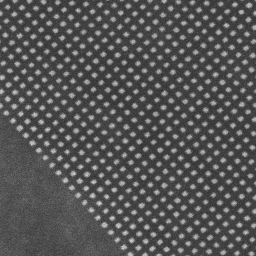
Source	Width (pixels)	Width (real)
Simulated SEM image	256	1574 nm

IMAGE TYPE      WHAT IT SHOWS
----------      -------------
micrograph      a regular array of raised bodies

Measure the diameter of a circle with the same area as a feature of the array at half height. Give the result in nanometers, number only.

30.2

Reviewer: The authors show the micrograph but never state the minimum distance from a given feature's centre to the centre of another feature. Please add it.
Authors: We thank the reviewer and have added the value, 59.7 nanometers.